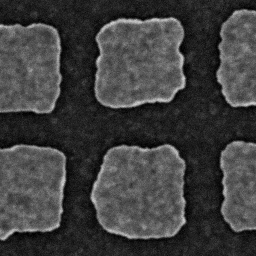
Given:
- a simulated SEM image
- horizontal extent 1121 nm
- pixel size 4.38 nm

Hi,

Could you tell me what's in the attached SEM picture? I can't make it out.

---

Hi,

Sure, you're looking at raised bodies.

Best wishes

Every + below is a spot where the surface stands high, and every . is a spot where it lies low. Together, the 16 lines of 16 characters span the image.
................
.......++++...++
++++..+++++...++
++++..+++++...++
++++..+++++...++
++++..+++++...++
+++...+++......+
................
................
++++...++++...++
++++..++++++..++
++++..+++++...++
++++..+++++...++
++++..+++++...++
+......++++.....
................